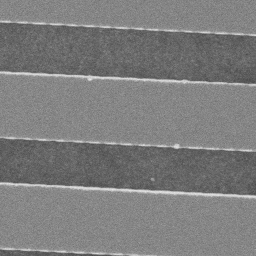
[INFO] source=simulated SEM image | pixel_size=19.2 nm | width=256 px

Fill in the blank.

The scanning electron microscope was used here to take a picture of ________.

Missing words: lines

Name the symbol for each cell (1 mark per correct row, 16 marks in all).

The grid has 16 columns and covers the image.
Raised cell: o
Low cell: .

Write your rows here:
oooooooooooooooo
...ooooooooooooo
................
................
................
oooooooooooooooo
oooooooooooooooo
oooooooooooooooo
oooooooooooooooo
................
................
o...............
oooooooooooooooo
oooooooooooooooo
oooooooooooooooo
oooooooooooooooo